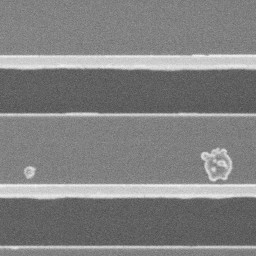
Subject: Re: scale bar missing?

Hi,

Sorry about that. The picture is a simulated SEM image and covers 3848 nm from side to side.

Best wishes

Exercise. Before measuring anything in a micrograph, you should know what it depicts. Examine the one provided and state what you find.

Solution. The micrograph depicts lines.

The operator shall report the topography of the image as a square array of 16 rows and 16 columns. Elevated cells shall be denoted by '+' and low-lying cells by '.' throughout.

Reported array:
++++++++++++++++
++++++++++++++++
++++++++++++++++
++++++++++++++++
................
................
................
++++++++++++++++
++++++++++++++++
++++++++++++++++
++++++++++++++++
++++++++++++++++
................
................
................
++++++++++++++++